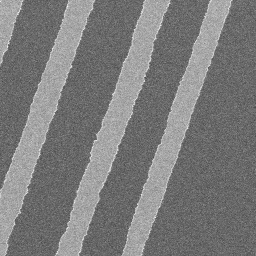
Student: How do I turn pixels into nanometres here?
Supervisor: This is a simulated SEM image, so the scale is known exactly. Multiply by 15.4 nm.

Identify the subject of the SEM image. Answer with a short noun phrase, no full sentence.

one or a few lines or trenches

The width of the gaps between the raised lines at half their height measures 681 nm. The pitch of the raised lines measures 990 nm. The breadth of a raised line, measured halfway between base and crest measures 329 nm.